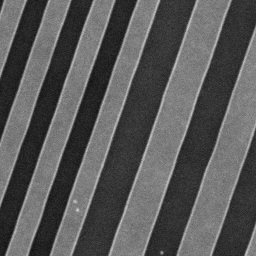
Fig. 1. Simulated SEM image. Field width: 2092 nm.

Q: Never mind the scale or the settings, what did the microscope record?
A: groups of lines, slits or small figures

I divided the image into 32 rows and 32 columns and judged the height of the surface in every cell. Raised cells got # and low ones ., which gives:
###...###...##...###....#####...
###...##...###...##.....####....
##...###...###..###.....####....
##...###..###...###....#####....
##...##...###...##.....####.....
#...###...###..###.....####....#
#...###..###...###....#####....#
#...##...###...##.....####....##
...###...###..###.....####....##
...###..###...###....#####....##
...##...###...##.....####....###
..###...###..###.....####....###
..###..###...###....#####....###
.###...###...##.....####....####
.###...##...###.....####....####
.###..###...###....#####....####
###...###...##.....####....#####
###...##...###.....####....####.
###..###...###....#####....####.
##...###...##.....####....#####.
##...##...###.....####....####..
#...###...###....#####....####..
#...###..###.....####....#####..
#...##...###....#####....####...
...###...###....#####....####...
...###..###.....####....#####...
...##...###....#####....####....
..###...###....####.....####....
..###..###.....####....#####....
..##...###....#####....####....#
.###...##.....####.....####....#
.###..###.....####....#####....#